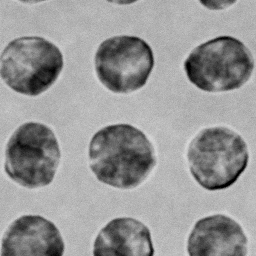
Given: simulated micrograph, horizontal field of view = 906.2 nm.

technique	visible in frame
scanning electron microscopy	holes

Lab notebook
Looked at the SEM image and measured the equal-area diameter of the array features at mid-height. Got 217 nm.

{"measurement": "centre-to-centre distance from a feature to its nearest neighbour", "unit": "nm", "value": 327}